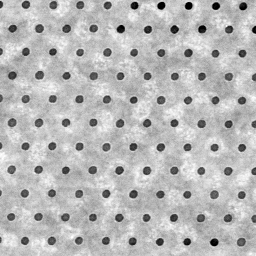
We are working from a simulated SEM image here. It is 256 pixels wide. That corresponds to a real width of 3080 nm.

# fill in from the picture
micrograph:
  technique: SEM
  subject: a regular array of holes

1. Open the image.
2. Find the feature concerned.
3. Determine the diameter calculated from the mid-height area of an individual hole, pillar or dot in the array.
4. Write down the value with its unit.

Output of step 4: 8.89 px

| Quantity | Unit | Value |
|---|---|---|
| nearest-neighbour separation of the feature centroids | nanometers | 322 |